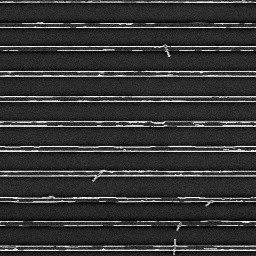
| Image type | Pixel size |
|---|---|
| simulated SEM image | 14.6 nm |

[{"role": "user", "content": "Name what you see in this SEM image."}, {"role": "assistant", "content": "parallel lines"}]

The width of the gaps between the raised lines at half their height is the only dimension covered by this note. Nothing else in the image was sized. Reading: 297 nm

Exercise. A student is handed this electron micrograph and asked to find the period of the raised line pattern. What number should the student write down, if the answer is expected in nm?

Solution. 361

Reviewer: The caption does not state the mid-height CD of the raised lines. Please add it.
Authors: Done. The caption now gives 74.8 nm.